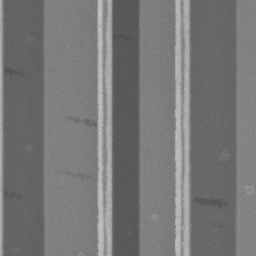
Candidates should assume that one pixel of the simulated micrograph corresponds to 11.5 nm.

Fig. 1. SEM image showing lines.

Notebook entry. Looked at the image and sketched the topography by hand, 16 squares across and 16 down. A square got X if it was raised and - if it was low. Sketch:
---XXXX--XXX---X
---XXXX--XXX---X
---XXXX--XXX---X
---XXXX--XXX---X
---XXXX--XXX---X
---XXXX--XXX---X
---XXXX--XXX---X
---XXXX--XXX---X
---XXXX--XXX---X
---XXXX--XXX---X
---XXXX--XXX---X
---XXXX--XXX---X
---XXXX--XXX---X
---XXXX--XXX---X
---XXXX--XXX---X
---XXXX--XXX---X